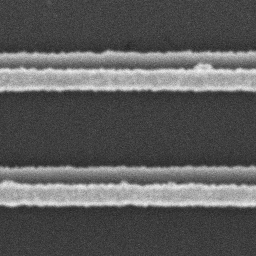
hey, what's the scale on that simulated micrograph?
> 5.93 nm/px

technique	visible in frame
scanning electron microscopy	lines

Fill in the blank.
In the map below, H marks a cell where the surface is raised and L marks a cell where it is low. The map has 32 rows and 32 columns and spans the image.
LLLLLLLLLLLLLLLLLLLLLLLLLLLLLLLL
LLLLLLLLLLLLLLLLLLLLLLLLLLLLLLLL
LLLLLLLLLLLLLLLLLLLLLLLLLLLLLLLL
LLLLLLLLLLLLLLLLLLLLLLLLLLLLLLLL
LLLLLLLLLLLLLLLLLLLLLLLLLLLLLLLL
LLLLLLLLLLLLLLLLLLLLLLLLLLLLLLLL
LLLLLLLLLLLLLHLLLLLLLLLHLLLLLLLL
HHHHHHHHHHHHHHHHHHHHHHHHHHHHHHHH
HHHHHHHHHHHHHHHHHHHHHHHHHHHHHHHH
HHHHHHHHHHHHHHHHHHHHHHHHHHHHHHHH
HHHHHHHHHHHHHHHHHHHHHHHHHHHHHHHH
LLLLLLLLLLLLLLLLLLLLLLLLLLLLLLLL
LLLLLLLLLLLLLLLLLLLLLLLLLLLLLLLL
LLLLLLLLLLLLLLLLLLLLLLLLLLLLLLLL
LLLLLLLLLLLLLLLLLLLLLLLLLLLLLLLL
LLLLLLLLLLLLLLLLLLLLLLLLLLLLLLLL
LLLLLLLLLLLLLLLLLLLLLLLLLLLLLLLL
LLLLLLLLLLLLLLLLLLLLLLLLLLLLLLLL
LLLLLLLLLLLLLLLLLLLLLLLLLLLLLLLL
LLLLLLLLLLLLLLLLLLLLLLLLLLLLLLLL
LLLLLLLLLLLLLLLLLLLLLLLLLLLLLLLL
HHHHHHHHHHHHHHHHHHHHHHHHHHHHHHHH
HHHHHHHHHHHHHHHHHHHHHHHHHHHHHHHH
HHHHHHHHHHHHHHHHHHHHHHHHHHHHHHHH
HHHHHHHHHHHHHHHHHHHHHHHHHHHHHHHH
HHHHHHHHHHHHHHHHHHHHHHHHHHHHHHHH
LLLLLLLLLLLLLLLLLLLLLLLLLLLLLLLL
LLLLLLLLLLLLLLLLLLLLLLLLLLLLLLLL
LLLLLLLLLLLLLLLLLLLLLLLLLLLLLLLL
LLLLLLLLLLLLLLLLLLLLLLLLLLLLLLLL
LLLLLLLLLLLLLLLLLLLLLLLLLLLLLLLL
LLLLLLLLLLLLLLLLLLLLLLLLLLLLLLLL